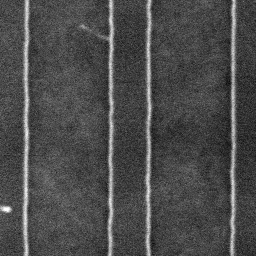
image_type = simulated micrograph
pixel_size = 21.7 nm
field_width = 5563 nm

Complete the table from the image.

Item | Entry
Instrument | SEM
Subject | wiring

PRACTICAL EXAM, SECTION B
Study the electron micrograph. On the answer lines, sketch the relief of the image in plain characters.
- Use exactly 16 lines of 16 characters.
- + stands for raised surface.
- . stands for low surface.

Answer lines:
++.....++......+
++.....++......+
++.....++......+
++.....++......+
++.....++......+
++.....++......+
++.....++......+
++.....++......+
++.....++......+
++.....++......+
++.....++.....++
++.....++.....++
++.....++......+
++.....++.....++
++.....++.....++
++.....++.....++